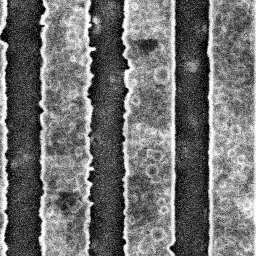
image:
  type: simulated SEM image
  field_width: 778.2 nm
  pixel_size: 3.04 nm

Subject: one or a few lines or trenches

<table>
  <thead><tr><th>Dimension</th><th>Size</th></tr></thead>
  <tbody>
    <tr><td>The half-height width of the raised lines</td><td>141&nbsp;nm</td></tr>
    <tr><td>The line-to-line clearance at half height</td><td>114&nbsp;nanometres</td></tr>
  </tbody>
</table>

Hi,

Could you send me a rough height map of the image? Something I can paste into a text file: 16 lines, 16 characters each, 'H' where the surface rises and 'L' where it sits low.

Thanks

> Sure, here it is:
LLLHHLLLHHHLLHHH
LLLHHLLLHHHLLHHH
LLLHHLLLHHHLLHHH
LLLHHHLLHHHLLHHH
LLLHHHLLHHHLLHHH
LLLHHLLLHHHLLHHH
LLLHHHLLHHHLLHHH
LLLHHHLLHHHLLHHH
LLLHHLLLHHHLLHHH
LLLHHHLLHHHLLHHH
LLLHHHLLHHHLLHHH
LLLHHHLLHHHLLHHH
LLLHHHLLHHHLLHHH
LLLHHLLLHHHLLHHH
LLLHHLLLHHHLLHHH
LLLHHLLLHHHLLHHH